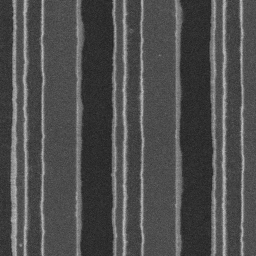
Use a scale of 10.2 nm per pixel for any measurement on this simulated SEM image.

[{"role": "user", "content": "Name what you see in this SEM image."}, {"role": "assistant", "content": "lines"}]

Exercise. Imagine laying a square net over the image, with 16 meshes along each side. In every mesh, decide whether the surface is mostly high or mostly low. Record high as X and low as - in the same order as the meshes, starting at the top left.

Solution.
-XXXX--XXXX--XXX
-XXXX--XXXX--XXX
-XXXX--XXXX--XXX
-XXXX--XXXX--XXX
-XXXX--XXXX--XXX
-XXXX--XXXX--XXX
-XXXX--XXXX--XXX
-XXXX--XXXX--XXX
-XXXX--XXXX--XXX
-XXXX--XXXX--XXX
-XXXX--XXXX--XXX
-XXXX--XXXX--XXX
-XXXX--XXXX--XXX
-XXXX--XXXX--XXX
-XXXX--XXXX--XXX
-XXXX--XXXX--XXX